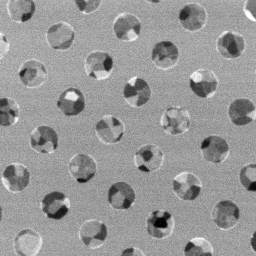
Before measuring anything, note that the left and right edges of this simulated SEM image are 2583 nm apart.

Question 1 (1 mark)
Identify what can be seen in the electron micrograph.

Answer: a regular array of raised bodies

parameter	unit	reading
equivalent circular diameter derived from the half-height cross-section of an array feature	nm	284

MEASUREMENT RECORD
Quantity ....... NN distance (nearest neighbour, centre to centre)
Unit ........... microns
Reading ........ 0.468